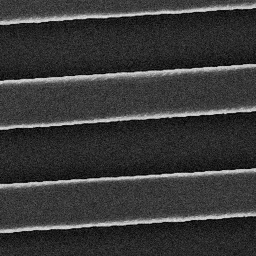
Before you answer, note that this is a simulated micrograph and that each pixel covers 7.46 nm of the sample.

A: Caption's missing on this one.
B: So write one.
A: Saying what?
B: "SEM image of lines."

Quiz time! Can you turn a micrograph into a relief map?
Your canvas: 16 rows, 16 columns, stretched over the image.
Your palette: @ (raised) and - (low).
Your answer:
@@@@@@@@@@@@@@@-
----------------
----------------
----------------
----------@@@@@@
@@@@@@@@@@@@@@@@
@@@@@@@@@@@@@@@@
@@@@@@@---------
----------------
----------------
----------------
-@@@@@@@@@@@@@@@
@@@@@@@@@@@@@@@@
@@@@@@@@@@@@@@@-
@---------------
----------------